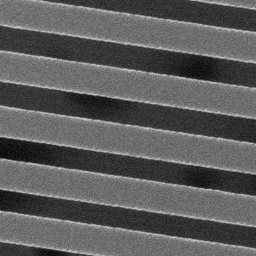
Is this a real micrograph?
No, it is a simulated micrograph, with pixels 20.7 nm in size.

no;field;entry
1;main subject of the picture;lines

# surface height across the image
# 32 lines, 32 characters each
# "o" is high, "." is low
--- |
oooooooo....................oooo
oooooooooooooo..................
ooooooooooooooooooooo...........
..oooooooooooooooooooooooooo....
.........ooooooooooooooooooooooo
................oooooooooooooooo
o.....................oooooooooo
oooooooo......................oo
ooooooooooooooo.................
oooooooooooooooooooooo..........
...ooooooooooooooooooooooooo....
.........ooooooooooooooooooooooo
................oooooooooooooooo
o......................ooooooooo
ooooooooo.....................oo
ooooooooooooooo.................
oooooooooooooooooooooo..........
...oooooooooooooooooooooooooo...
.........ooooooooooooooooooooooo
.................ooooooooooooooo
oooo...................ooooooooo
ooooooooooo...................oo
oooooooooooooooooo..............
ooooooooooooooooooooooooo.......
......ooooooooooooooooooooooooo.
.............ooooooooooooooooooo
o..................ooooooooooooo
ooooooo...................oooooo
oooooooooooooo..................
ooooooooooooooooooooo...........
..oooooooooooooooooooooooooo....
.........ooooooooooooooooooooooo